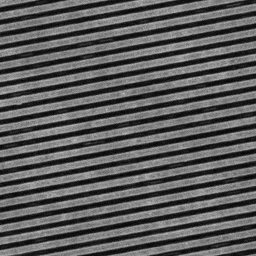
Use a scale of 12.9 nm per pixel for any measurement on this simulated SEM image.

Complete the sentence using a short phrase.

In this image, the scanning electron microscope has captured parallel lines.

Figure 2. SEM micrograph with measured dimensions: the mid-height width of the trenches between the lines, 75.9 nm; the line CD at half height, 87 nm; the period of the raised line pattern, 158 nm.